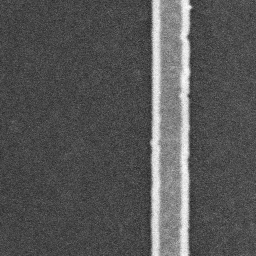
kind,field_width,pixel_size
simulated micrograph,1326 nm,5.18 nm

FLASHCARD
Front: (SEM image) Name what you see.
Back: one or a few lines or trenches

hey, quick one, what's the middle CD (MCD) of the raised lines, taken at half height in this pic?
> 148 nanometers